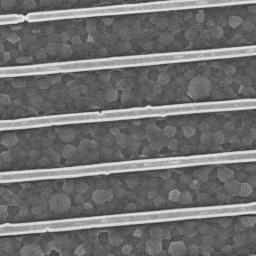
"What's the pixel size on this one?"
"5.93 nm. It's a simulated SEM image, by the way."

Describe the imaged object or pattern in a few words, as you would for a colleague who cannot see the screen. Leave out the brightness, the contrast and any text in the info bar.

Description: parallel lines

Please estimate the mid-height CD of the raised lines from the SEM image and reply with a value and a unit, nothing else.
53.1 nm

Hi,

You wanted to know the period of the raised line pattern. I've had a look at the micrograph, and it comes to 310 nanometres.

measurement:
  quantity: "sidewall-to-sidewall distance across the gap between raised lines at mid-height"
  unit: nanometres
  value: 255